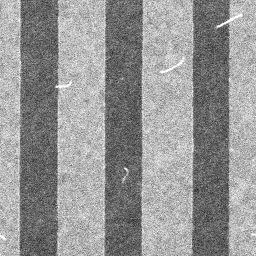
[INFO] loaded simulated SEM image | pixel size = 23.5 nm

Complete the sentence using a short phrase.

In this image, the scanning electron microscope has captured one or a few lines or trenches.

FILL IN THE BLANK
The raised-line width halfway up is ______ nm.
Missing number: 1130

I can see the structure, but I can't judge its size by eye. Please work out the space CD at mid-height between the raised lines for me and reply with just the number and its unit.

877 nanometers